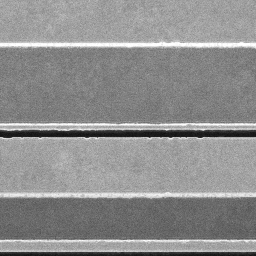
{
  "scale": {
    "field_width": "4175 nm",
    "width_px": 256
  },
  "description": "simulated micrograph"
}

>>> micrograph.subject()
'lines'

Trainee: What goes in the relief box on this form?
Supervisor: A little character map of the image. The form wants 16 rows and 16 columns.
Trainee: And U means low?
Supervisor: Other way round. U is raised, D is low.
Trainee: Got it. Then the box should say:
UUUUUUUUUUUUUUUU
UUUUUUUUUUUUUUUU
UUUUUUUUUUUUUUUU
DDDDDDDDDDDDDDDD
DDDDDDDDDDDDDDDD
DDDDDDDDDDDDDDDD
DDDDDDDDDDDDDDDD
DDDDDDDDDDDDDDDD
UUUUUUUUUUUUUUUU
UUUUUUUUUUUUUUUU
UUUUUUUUUUUUUUUU
UUUUUUUUUUUUUUUU
DDDDDDDDDDDDDDDD
DDDDDDDDDDDDDDDD
DDDDDDDDDDDDDDDD
UUUUUUUUUUUUUUUU